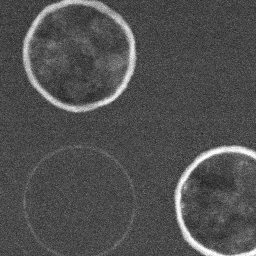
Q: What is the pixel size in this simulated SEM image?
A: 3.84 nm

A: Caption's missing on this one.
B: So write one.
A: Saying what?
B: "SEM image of raised bodies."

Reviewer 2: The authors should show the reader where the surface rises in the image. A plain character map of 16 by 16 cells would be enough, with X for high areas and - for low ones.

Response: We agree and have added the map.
---XXX----------
--XXXXXX--------
--XXXXXX--------
--XXXXXX--------
--XXXXXX--------
--XXXXXX--------
----XX----------
----------------
----------------
-------------XXX
------------XXXX
-----------XXXXX
-----------XXXXX
-----------XXXXX
------------XXXX
------------XXXX